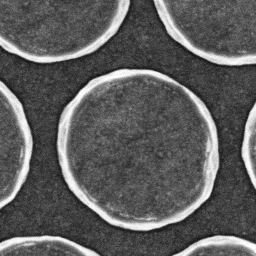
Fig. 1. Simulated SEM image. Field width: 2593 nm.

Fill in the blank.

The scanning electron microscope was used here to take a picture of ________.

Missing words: raised bodies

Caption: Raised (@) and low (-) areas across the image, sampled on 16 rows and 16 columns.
@@@@@@@@--@@@@@@
@@@@@@@----@@@@@
@@@@@@-----@@@@@
--@@@--------@@@
----------------
------@@@@@-----
@----@@@@@@@----
@---@@@@@@@@@---
@@--@@@@@@@@@--@
@@--@@@@@@@@@--@
@@--@@@@@@@@@---
@---@@@@@@@@@---
@----@@@@@@@@---
------@@@@@@----
----------------
@@@@@-------@@@@